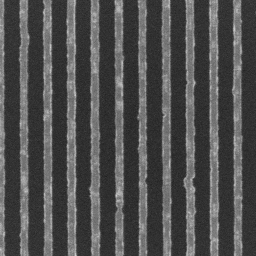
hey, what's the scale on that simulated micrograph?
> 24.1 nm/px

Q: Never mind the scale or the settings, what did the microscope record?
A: parallel lines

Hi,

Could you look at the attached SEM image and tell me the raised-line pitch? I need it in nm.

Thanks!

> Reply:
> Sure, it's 573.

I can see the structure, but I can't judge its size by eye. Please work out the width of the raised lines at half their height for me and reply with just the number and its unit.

6.75 pixels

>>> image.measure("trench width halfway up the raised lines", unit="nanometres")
404